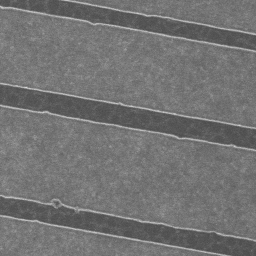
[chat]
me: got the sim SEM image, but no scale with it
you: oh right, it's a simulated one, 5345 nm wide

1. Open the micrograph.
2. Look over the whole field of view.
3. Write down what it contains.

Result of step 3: one or a few lines or trenches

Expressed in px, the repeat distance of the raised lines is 103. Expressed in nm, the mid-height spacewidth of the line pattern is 1680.